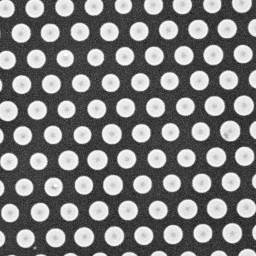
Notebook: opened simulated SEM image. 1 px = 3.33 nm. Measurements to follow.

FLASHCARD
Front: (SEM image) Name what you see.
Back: an array of small figures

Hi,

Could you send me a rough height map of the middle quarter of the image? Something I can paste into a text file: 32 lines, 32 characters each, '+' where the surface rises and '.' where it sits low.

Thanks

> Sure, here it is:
+...............................
................................
..................++.....+++....
...+++....+++....++++...++++....
..++++....++++...++++...++++....
..++++....++++...++++....+++....
...+++....+++.....++............
................................
................................
++.....+++....+++....++++...++++
+++...++++...+++++...++++...++++
+++...++++...+++++...++++...++++
++....++++....+++....++++....+++
................................
................................
...........++.....+++....+++....
...+++....++++...++++....++++...
...++++...++++...++++....++++...
...++++...++++...++++....+++....
...+++.....++...................
................................
..............................+.
+++...++++....++++...++++....+++
+++...+++++..+++++...++++....+++
+++...+++++...++++...++++....+++
+++....+++....+++.....+++.....+.
................................
................................
....++.....+++....+++....++++...
...++++...++++....++++...++++...
...++++...+++++..+++++...++++...
...++++...++++....+++.....++....